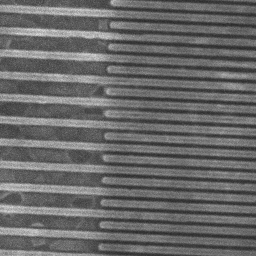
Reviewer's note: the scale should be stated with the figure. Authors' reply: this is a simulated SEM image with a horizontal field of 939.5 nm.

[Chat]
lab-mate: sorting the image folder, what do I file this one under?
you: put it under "parallel lines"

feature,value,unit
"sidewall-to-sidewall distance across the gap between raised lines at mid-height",0.0165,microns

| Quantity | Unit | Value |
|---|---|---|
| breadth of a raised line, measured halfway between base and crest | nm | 22.9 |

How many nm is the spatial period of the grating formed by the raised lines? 40.8